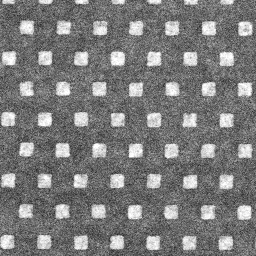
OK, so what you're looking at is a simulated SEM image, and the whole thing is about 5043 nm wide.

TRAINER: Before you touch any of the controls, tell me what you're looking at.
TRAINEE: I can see a regular array of raised bodies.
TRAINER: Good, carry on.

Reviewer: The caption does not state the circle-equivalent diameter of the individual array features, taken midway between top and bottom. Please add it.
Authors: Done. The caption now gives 282 nm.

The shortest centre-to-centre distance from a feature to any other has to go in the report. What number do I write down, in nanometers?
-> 695